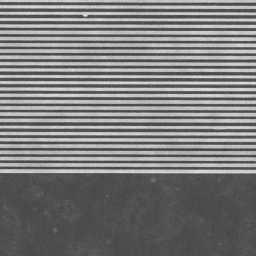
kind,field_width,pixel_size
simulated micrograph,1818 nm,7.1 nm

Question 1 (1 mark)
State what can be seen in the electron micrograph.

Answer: parallel lines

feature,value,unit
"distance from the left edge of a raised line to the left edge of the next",44.8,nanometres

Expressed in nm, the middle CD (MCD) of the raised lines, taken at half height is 24.8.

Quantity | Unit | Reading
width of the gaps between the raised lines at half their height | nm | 19.5